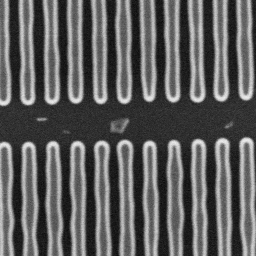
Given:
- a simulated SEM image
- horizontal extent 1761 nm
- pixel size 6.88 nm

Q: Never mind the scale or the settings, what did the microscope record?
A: groups of lines, slits or small figures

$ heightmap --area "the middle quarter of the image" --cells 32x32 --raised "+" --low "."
..++....++....++....++....++....
..++....++....++....+++...++....
..++....++....++....+++...++....
.+++....++....+++...+++...++....
.+++....++...++++...++....++....
.+++....++...++++...++....++....
..++....++....++....++....++....
..++....++....++....++....++....
..++....++....++.....+....++....
................................
................................
................................
................................
................................
................................
................................
................................
................................
................................
................................
..++....+++...+++...++.....+....
..+++...+++...+++...+++....+....
..+++...+++...+++...+++....++...
..+++...+++...+++...+++....++...
..+++...+++...+++...+++...+++...
..+++...+++...+++...+++...+++...
..+++...+++...+++...+++...+++...
..+++...+++...+++...+++...+++...
..+++...+++...+++...+++...+++...
..+++...+++...+++...+++...+++...
..+++...+++...+++...+++...+++...
..+++...+++...+++...+++...+++...